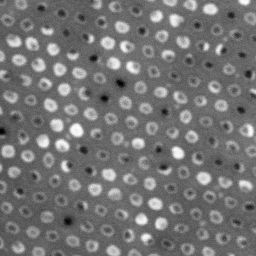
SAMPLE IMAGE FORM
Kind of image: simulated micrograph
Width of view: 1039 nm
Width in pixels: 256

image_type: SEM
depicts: a regular array of raised bodies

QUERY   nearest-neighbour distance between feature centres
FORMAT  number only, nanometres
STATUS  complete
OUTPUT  81.4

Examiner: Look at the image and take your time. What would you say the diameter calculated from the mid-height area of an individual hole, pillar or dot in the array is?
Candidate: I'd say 44.9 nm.